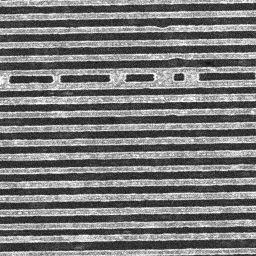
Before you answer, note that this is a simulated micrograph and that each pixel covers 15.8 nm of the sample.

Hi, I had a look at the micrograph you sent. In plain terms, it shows parallel lines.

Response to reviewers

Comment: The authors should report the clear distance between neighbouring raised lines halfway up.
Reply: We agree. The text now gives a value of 8.37 pixels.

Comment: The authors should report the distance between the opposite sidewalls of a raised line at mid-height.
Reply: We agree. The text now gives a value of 92.8 nm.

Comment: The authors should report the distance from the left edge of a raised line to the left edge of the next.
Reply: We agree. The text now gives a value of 0.22 microns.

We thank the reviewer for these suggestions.